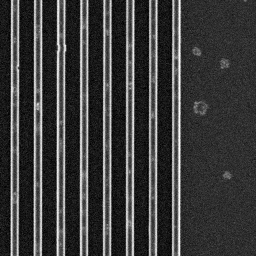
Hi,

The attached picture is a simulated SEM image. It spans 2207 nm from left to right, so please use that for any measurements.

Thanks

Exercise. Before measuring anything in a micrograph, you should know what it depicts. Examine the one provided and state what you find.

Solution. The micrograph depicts parallel lines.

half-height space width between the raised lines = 138 nanometres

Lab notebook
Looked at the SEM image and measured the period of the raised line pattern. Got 199 nm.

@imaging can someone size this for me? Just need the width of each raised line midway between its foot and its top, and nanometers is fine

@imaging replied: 61.4